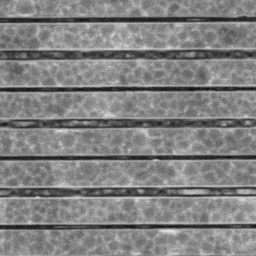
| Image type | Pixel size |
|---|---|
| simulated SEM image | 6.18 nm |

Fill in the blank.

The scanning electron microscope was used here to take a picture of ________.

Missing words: parallel lines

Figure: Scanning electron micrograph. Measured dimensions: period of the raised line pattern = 34.8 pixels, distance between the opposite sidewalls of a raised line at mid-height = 163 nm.